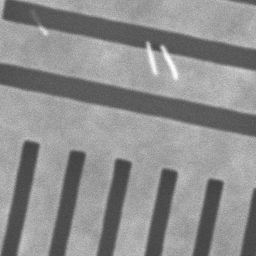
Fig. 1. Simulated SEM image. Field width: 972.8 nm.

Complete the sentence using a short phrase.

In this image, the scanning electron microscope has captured groups of lines, slits or small figures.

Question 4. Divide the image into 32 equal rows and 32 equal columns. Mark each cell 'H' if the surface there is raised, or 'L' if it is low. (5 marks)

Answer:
HLLLHHHHHHHHHHHHHHHHHHHHHHHHHHHL
LLLLLLLLLHHHHHHHHHHHHHHHHHHHHHHH
HLLLLLLLLLLLLLHHHHHHHHHHHHHHHHHH
HHHHHHLLLLLLLLLLLLLHHHHHHHHHHHHH
HHHHHHHHHHLLLLLLLLLLLLLLHHHHHHHH
HHHHHHHHHHHHHHHLLLLLLLLLLLLLLHHH
HHHHHHHHHHHHHHHHHHHHHLLLLLLLLLLL
HHHHHHHHHHHHHHHHHHHHHHHHHLLLLLLL
LLLLHHHHHHHHHHHHHHHHHHHHHHHHHHLL
LLLLLLLLHHHHHHHHHHHHHHHHHHHHHHHH
LLLLLLLLLLLLLHHHHHHHHHHHHHHHHHHH
HHHHLLLLLLLLLLLLLLHHHHHHHHHHHHHH
HHHHHHHHHLLLLLLLLLLLLLLHHHHHHHHH
HHHHHHHHHHHHHHLLLLLLLLLLLLLLHHHH
HHHHHHHHHHHHHHHHHHHLLLLLLLLLLLLL
HHHHHHHHHHHHHHHHHHHHHHHLLLLLLLLL
HHHHHHHHHHHHHHHHHHHHHHHHHHHHHLLL
HHHHHHHHHHHHHHHHHHHHHHHHHHHHHHHH
HHHLLHHHHHHHHHHHHHHHHHHHHHHHHHHH
HHHLLHHHHLLHHHHHHHHHHHHHHHHHHHHH
HHLLLHHHLLLHHHLLHHHHHHHHHHHHHHHH
HHLLHHHHLLHHHHLLHHHHLLHHHHHHHHHH
HHLLHHHHLLHHHHLLHHHHLLHHHHLHHHHH
HHLLHHHHLLHHHHLLHHHHLLHHHHLLHHHH
HHLLHHHHLLHHHLLLHHHHLLHHHHLLHHHL
HLLLHHHLLHHHHLLHHHHLLHHHHLLHHHHL
HLLHHHHLLHHHHLLHHHHLLHHHHLLHHHHL
HLLHHHHLLHHHHLLHHHHLLHHHHLLHHHHL
HLLHHHHLLHHHHLLHHHHLLHHHHLLHHHHL
HLLHHHLLLHHHHLLHHHLLLHHHHLLHHHHL
LLHHHHLLHHHHLLHHHHLLHHHHLLHHHHLL
LLHHHHLLHHHHLLHHHHLLHHHHLLHHHHLL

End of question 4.